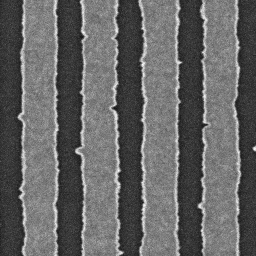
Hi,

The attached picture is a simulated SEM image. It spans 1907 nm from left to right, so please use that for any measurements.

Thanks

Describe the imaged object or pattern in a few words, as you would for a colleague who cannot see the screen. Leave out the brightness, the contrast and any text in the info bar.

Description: parallel lines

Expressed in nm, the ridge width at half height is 250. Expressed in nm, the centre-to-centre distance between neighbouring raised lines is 449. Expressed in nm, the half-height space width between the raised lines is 195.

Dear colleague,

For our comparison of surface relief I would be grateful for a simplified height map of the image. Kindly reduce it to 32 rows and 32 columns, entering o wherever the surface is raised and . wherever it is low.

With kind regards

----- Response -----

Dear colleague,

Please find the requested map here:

...oooo...ooooo..ooooo...ooooo..
...oooo...ooooo...oooo...ooooo..
...oooo...oooo....oooo....oooo..
...oooo...ooooo...oooo....ooo...
...oooo....ooo....oooo....oooo..
...oooo...ooooo...oooo....oooo..
...oooo...ooooo...oooo....oooo..
...oooo....ooo....oooo...ooooo..
...oooo....ooo....oooo...ooooo..
...oooo...oooo....oooo....oooo..
...oooo...oooo....oooo....oooo..
...oooo...oooo....oooo....oooo..
...oooo...oooo....oooo....ooo...
...oooo...oooo....oooo....ooo...
...oooo...oooo....oooo....ooo...
...oooo...ooooo...oooo....oooo..
...oooo...ooooo...oooo...ooooo..
...oooo...ooooo...oooo...ooooo..
...oooo...ooooo...oooo....oooo..
...oooo...ooooo...oooo...ooooo..
...oooo...ooooo...oooo...ooooo..
...oooo...ooooo...oooo...ooooo..
...oooo...ooooo...oooo...ooooo..
...oooo....oooo...oooo...ooooo..
...oooo....oooo...oooo...ooooo..
...oooo....oooo...oooo...ooooo..
...oooo...ooooo...oooo...ooooo..
...oooo....oooo...oooo...ooooo..
...oooo...ooooo...oooo...ooooo..
...oooo...ooooo...oooo...ooooo..
...oooo...ooooo...oooo...ooooo..
...oooo...ooooo...oooo...ooooo..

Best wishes